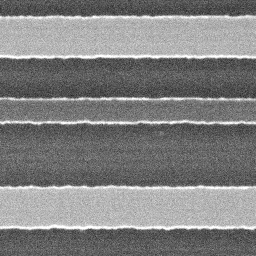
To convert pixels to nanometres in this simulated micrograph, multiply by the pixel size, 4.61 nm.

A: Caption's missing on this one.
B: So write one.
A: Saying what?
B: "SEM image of lines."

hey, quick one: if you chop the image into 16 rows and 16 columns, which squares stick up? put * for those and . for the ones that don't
................
****************
****************
****************
................
................
****************
****************
................
................
................
................
****************
****************
................
................